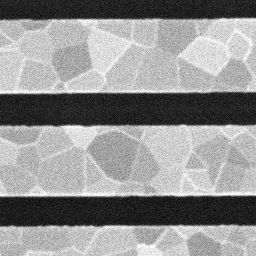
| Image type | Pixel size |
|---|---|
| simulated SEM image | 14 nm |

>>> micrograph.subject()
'lines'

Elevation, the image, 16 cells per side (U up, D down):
DDDDDDDDDDDDDDDD
UUUUUUUUUUUUUUUU
UUUUUUUUUUUUUUUU
UUUUUUUUUUUUUUUU
UUUUUUUUUUUUUUUU
UUUUUUUUUUUUUUUU
DDDDDDDDDDDDDDDD
DDDDDDDDDDDDDDDD
UUUUUUUUUUUUUUUU
UUUUUUUUUUUUUUUU
UUUUUUUUUUUUUUUU
UUUUUUUUUUUUUUUU
DDDDDDDDDDDDDDDD
DDDDDDDDDDDDDDDD
UUUUUUUUUUUUUUUU
UUUUUUUUUUUUUUUU